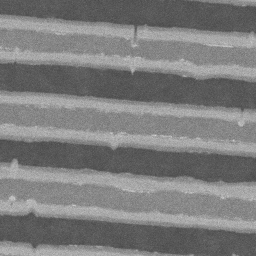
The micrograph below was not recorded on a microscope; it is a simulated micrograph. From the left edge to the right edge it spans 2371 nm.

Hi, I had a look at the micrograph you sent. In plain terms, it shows one or a few lines or trenches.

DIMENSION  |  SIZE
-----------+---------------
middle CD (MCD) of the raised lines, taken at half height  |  0.29 microns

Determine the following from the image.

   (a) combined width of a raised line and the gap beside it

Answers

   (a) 696 nm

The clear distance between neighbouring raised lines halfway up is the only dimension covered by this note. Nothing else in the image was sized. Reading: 411 nm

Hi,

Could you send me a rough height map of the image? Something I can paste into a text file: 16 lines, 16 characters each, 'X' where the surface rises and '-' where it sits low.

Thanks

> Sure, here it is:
----------------
X---------------
XXXXXXXXXXXXXX--
-XX-XXXXXXXXXXXX
---------------X
----------------
XXXXX-----------
XXXXXXXXXXXXXXXX
------XXXXXXXXXX
----------------
----------------
XXXXXXXX--------
XXXXXXXXXXXXXXXX
--------XXXXXXXX
----------------
----------------